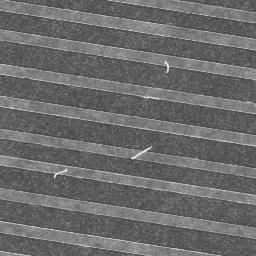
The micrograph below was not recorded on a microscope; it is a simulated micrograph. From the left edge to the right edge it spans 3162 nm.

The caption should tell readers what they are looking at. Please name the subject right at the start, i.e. parallel lines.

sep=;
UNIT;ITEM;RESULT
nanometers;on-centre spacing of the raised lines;379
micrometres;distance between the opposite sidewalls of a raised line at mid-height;0.131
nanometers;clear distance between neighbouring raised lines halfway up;264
